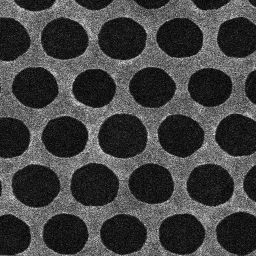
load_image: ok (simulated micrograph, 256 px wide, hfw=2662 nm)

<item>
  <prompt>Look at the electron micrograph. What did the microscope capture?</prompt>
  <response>a regular array of holes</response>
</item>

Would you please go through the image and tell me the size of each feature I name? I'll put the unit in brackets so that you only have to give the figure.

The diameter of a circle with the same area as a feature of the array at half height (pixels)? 44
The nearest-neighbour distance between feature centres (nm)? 588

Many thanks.